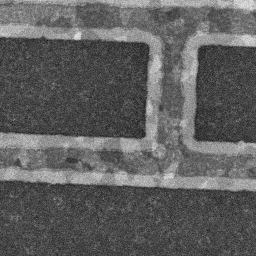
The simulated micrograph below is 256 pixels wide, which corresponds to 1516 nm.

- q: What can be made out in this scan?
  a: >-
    one or a few lines or trenches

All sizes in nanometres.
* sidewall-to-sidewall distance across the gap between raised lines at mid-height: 646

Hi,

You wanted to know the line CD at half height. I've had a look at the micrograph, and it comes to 0.207 microns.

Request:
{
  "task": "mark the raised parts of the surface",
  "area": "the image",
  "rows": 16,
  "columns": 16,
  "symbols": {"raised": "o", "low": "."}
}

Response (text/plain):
oooooooooooooooo
oooooooooooooooo
.........oooo..o
..........oo....
..........oo....
..........oo....
..........oo....
..........oo....
..........oo....
oooooooooooooooo
oooooooooooooooo
...............o
................
................
................
................